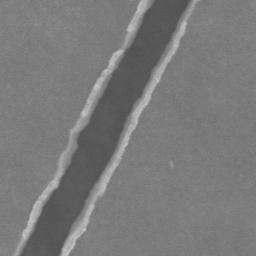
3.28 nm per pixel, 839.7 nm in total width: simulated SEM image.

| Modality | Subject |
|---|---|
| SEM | one or a few lines or trenches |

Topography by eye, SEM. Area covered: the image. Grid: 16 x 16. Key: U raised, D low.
UUUUUUUUUDDDUUUU
UUUUUUUUUDDUUUUU
UUUUUUUUDDDUUUUU
UUUUUUUUDDUUUUUU
UUUUUUUDDDUUUUUU
UUUUUUDDDUUUUUUU
UUUUUUDDDUUUUUUU
UUUUUDDDUUUUUUUU
UUUUUDDDUUUUUUUU
UUUUDDDUUUUUUUUU
UUUUDDDUUUUUUUUU
UUUUDDUUUUUUUUUU
UUUDDDUUUUUUUUUU
UUDDDUUUUUUUUUUU
UUDDUUUUUUUUUUUU
UDDDUUUUUUUUUUUU